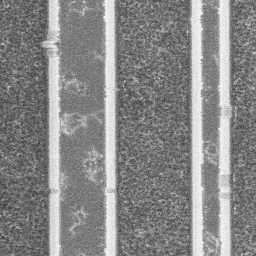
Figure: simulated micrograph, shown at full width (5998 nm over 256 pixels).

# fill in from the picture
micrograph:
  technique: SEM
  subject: one or a few lines or trenches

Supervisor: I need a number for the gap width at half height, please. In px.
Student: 87.7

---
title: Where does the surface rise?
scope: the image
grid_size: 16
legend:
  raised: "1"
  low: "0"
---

0001111000001100
0001111000001100
0001111000001100
0001111000001100
0001111000001100
0001111000001100
0001111000001100
0001111000001100
0001111000001100
0001111000001100
0001111000001100
0001111000001100
0001111000001100
0001111000001100
0001111000001100
0001111000001100